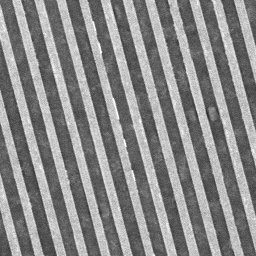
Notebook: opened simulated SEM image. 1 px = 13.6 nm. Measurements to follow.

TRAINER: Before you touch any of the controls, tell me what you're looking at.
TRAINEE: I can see parallel lines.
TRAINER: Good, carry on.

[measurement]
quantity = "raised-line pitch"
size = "293 nm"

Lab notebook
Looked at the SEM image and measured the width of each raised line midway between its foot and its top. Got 7.99 px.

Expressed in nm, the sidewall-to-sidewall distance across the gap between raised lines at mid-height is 178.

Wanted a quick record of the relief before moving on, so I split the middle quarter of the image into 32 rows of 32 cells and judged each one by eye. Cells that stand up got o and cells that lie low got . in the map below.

...oo...oo....oo...oo....oo...oo
...oo...oo....oo...oo....oo....o
...oo....oo...oo....oo...oo....o
...oo....oo....oo...oo....oo...o
....oo...oo....oo...oo....oo...o
....oo...oo....oo....oo...oo....
o...oo....oo...oo....oo...oo....
o...ooo...oo....oo...oo....oo...
o....oo...oo....oo...oo....oo...
o....oo...oo....oo....oo...oo...
oo...oo....oo...oo....oo....oo..
oo....oo...oo....oo...oo....oo..
oo....oo...oo....oo...oo....oo..
oo....oo...ooo...oo....oo...oo..
.oo...oo....oo...oo....oo....oo.
.oo....oo...oo....oo...oo....oo.
.oo....oo...oo....oo...oo....oo.
.oo....oo....oo...oo....oo...oo.
..oo...oo....oo...ooo...oo....oo
..oo....oo...oo....oo...oo....oo
..oo....oo...oo....oo...oo....oo
..oo....oo....oo...oo....oo...oo
...oo...oo....oo....oo...oo....o
...oo....oo...oo....oo...oo....o
...oo....oo...oo....oo...ooo...o
....oo...oo....oo...oo....oo...o
....oo...oo....oo....oo...oo....
o...oo....oo...oo....oo...oo....
o...oo....oo...oo....oo....oo...
o....oo...oo....oo...oo....oo...
o....oo....oo...oo....oo...oo...
oo...oo....oo...oo....oo...oo...